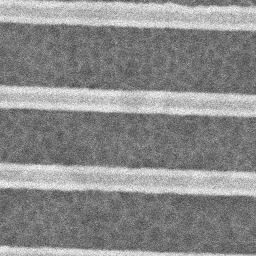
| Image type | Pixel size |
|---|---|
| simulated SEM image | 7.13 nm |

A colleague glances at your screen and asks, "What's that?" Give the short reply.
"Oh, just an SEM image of one or a few lines or trenches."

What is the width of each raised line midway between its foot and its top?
122 nm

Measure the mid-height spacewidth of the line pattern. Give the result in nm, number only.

462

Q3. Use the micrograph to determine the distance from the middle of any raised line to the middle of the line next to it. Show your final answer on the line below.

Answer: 588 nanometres